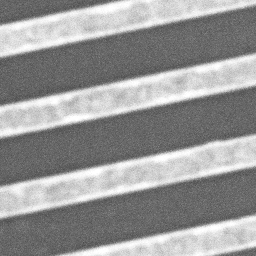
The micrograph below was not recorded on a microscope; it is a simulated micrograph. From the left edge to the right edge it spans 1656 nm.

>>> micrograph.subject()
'one or a few lines or trenches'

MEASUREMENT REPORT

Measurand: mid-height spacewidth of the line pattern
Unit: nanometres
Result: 341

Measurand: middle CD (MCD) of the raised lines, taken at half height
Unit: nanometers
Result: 170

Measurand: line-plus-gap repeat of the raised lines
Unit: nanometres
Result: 511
